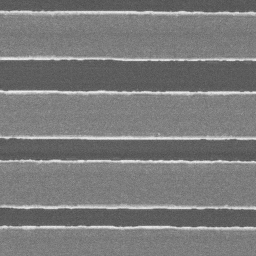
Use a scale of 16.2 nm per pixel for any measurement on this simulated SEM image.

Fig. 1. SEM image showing lines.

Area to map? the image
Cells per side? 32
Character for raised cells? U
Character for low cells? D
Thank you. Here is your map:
DDDDDDDDDDDDDDDDDDDDDDDDDDDDDDDD
DDDDDDDDDDDDDDDDDDDDDDDDDDDDDDDD
UUUUUUUUUUUUUUUUUUUUUUUUUUUUUUUU
UUUUUUUUUUUUUUUUUUUUUUUUUUUUUUUU
UUUUUUUUUUUUUUUUUUUUUUUUUUUUUUUU
UUUUUUUUUUUUUUUUUUUUUUUUUUUUUUUU
UUUUUUUUUUUUUUUUUUUUUUUUUUUUUUUU
DDDDDDDDDDDDDDDDDDDDDDDDDDDDDDDD
DDDDDDDDDDDDDDDDDDDDDDDDDDDDDDDD
DDDDDDDDDDDDDDDDDDDDDDDDDDDDDDDD
DDDDDDDDDDDDDDDDDDDDDDDDDDDDDDDD
UUUUUUUUDDDDDUDDDDDDDDDDDDDDDDDD
UUUUUUUUUUUUUUUUUUUUUUUUUUUUUUUU
UUUUUUUUUUUUUUUUUUUUUUUUUUUUUUUU
UUUUUUUUUUUUUUUUUUUUUUUUUUUUUUUU
UUUUUUUUUUUUUUUUUUUUUUUUUUUUUUUU
UUUUUUUUUUUUUUUUUUUUUUUUUUUUUUUU
DDDDDDDDDDDDDDDDDDDDDDDDDDDDDDDD
DDDDDDDDDDDDDDDDDDDDDDDDDDDDDDDD
DDDDDDDDDDDDDDDDDDDDDDDDDDDDDDDD
UUUUUUUUUUUUUUUUUUUUUUUUUUUUUUUU
UUUUUUUUUUUUUUUUUUUUUUUUUUUUUUUU
UUUUUUUUUUUUUUUUUUUUUUUUUUUUUUUU
UUUUUUUUUUUUUUUUUUUUUUUUUUUUUUUU
UUUUUUUUUUUUUUUUUUUUUUUUUUUUUUUU
UUUUUUUUUUUUUUUUUUUUUUUUUUUUUUUU
DDDDDDDDDDDDDDDDDDDDDDDDDDDDDDDD
DDDDDDDDDDDDDDDDDDDDDDDDDDDDDDDD
UUUUUUUUUUUUUUDDDUUUUUDDDDDDDDDD
UUUUUUUUUUUUUUUUUUUUUUUUUUUUUUUU
UUUUUUUUUUUUUUUUUUUUUUUUUUUUUUUU
UUUUUUUUUUUUUUUUUUUUUUUUUUUUUUUU